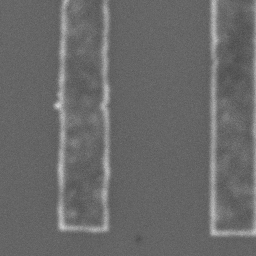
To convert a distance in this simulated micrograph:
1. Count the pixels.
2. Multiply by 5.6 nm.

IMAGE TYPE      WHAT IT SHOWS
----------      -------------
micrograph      one or a few lines or trenches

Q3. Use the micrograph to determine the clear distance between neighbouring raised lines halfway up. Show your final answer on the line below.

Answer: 596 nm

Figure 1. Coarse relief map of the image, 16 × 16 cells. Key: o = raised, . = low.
....ooo......ooo
....ooo......ooo
....ooo......ooo
....ooo......ooo
....ooo......ooo
....ooo......ooo
....ooo......ooo
....ooo......ooo
....ooo......ooo
....ooo......ooo
....ooo......ooo
....ooo......ooo
....ooo......ooo
....ooo......ooo
..............oo
................